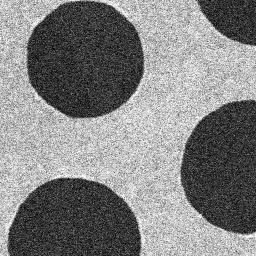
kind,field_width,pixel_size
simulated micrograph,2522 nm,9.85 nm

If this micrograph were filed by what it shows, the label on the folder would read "holes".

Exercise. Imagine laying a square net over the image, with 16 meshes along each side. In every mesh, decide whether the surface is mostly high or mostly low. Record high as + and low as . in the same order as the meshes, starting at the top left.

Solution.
++++...+++++....
++......+++++...
++.......++++++.
++.......+++++++
++.......+++++++
++.......+++++++
+++.....++++++..
+++++++++++++...
++++++++++++....
+++++++++++.....
+++++++++++.....
+++...+++++.....
+.......++++....
+.......+++++...
+........+++++..
.........+++++++